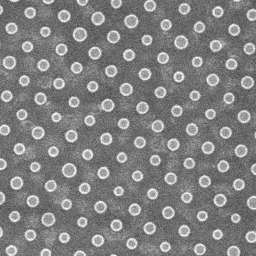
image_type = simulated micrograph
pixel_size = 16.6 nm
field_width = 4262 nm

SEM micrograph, a regular array of raised bodies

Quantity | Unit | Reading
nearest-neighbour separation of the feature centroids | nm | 394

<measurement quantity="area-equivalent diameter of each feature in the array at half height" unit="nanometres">173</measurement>